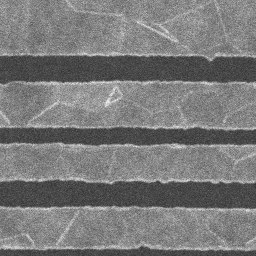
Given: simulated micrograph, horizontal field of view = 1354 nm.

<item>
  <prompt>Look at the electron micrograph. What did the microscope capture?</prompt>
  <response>one or a few lines or trenches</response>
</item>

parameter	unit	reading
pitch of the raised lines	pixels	61.8